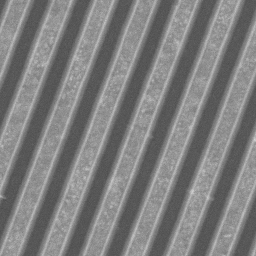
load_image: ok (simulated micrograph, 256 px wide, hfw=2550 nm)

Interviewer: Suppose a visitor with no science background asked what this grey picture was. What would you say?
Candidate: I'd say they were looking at parallel lines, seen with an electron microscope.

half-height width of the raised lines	209	nanometres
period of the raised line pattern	0.393	µm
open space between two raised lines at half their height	0.181	micrometres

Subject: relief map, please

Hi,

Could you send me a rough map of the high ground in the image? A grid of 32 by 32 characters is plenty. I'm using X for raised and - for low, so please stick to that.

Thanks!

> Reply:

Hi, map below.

-XXX--XXX--XXX---XXX--XXX--XXX--
-XX---XXX--XXX--XXX---XX---XXX--
XXX---XX---XXX--XXX--XXX---XX---
XXX--XXX--XXX---XX---XXX--XXX--X
XX---XXX--XXX--XXX---XX---XXX--X
XX--XXX---XX---XXX--XXX--XXX---X
X---XXX--XXX---XX---XXX--XXX--XX
X---XX---XXX--XXX--XXX---XX---XX
X--XXX--XXX---XXX--XXX--XXX---XX
---XXX--XXX--XXX---XX---XXX--XXX
---XX---XXX--XXX--XXX--XXX---XXX
--XXX--XXX---XX---XXX--XXX--XXX-
--XXX--XXX--XXX---XX---XXX--XXX-
-XXX---XX---XXX--XXX--XXX---XX--
-XXX--XXX---XX---XXX--XXX--XXX--
-XX---XXX--XXX--XXX---XX---XXX--
XXX--XXX---XXX--XXX--XXX---XX---
XXX--XXX--XXX---XX---XXX--XXX--X
XX---XXX--XXX--XXX--XXX---XXX--X
XX--XXX---XX---XXX--XXX--XXX---X
XX--XXX--XXX---XX---XXX--XXX--XX
X---XX---XXX--XXX--XXX---XX---XX
X--XXX---XX---XXX--XXX--XXX---XX
---XXX--XXX--XXX---XX---XXX--XXX
--XXX---XXX--XXX--XXX---XX---XXX
--XXX--XXX---XX---XXX--XXX--XXX-
--XX---XXX--XXX--XXX---XXX--XXX-
-XXX---XX---XXX--XXX--XXX---XX--
-XXX--XXX---XX---XXX--XXX--XXX--
-XX---XXX--XXX--XXX---XX---XXX--
XXX---XX---XXX--XXX--XXX---XX---
XXX--XXX--XXX---XX---XXX--XXX--X